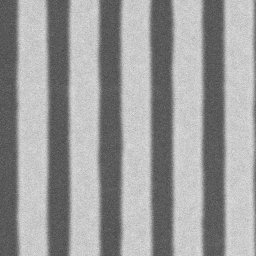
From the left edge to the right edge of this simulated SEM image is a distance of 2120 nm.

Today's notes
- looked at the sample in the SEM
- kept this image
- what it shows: wiring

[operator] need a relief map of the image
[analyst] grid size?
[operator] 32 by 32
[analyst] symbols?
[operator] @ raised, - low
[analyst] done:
--@@@@---@@@---@@@@---@@@---@@@@
--@@@@---@@@---@@@@---@@@---@@@@
--@@@@---@@@---@@@@---@@@---@@@@
--@@@@---@@@---@@@@---@@@---@@@@
--@@@@---@@@---@@@@---@@@---@@@@
--@@@@---@@@---@@@@---@@@---@@@@
--@@@@---@@@---@@@@---@@@---@@@@
--@@@@---@@@---@@@@---@@@---@@@@
--@@@@---@@@---@@@@---@@@---@@@@
--@@@@---@@@---@@@@---@@@---@@@@
--@@@@---@@@---@@@@---@@@---@@@@
--@@@@---@@@---@@@@---@@@---@@@@
--@@@@---@@@---@@@@---@@@---@@@@
--@@@@---@@@---@@@@---@@@---@@@-
--@@@@---@@@---@@@@---@@@---@@@-
--@@@@---@@@---@@@@---@@@---@@@@
--@@@@---@@@---@@@@---@@@---@@@@
--@@@@---@@@----@@@---@@@---@@@@
--@@@@---@@@----@@@---@@@---@@@@
--@@@@---@@@---@@@@---@@@---@@@@
--@@@@---@@@---@@@@---@@@---@@@@
--@@@@---@@@---@@@@---@@@---@@@@
--@@@@---@@@---@@@@---@@@---@@@-
--@@@@---@@@---@@@@---@@@---@@@@
--@@@@---@@@---@@@@---@@@---@@@@
--@@@@---@@@---@@@@---@@@---@@@@
--@@@@---@@@---@@@@---@@@---@@@@
--@@@@---@@@---@@@@---@@@---@@@@
--@@@@---@@@---@@@@---@@@---@@@@
--@@@@---@@@---@@@@---@@@---@@@@
---@@@---@@@---@@@@---@@@---@@@@
---@@@---@@@---@@@@---@@@---@@@@